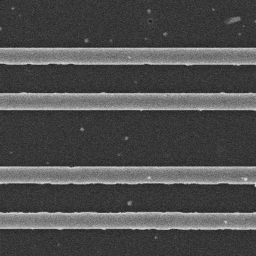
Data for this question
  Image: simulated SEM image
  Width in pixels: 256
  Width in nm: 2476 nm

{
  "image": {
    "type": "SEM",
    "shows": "lines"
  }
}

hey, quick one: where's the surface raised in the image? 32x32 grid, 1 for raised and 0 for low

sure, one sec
00000000000000000000000000000000
00000000000000000000000000000000
00000000000000000000000000000000
00000000000000000000000000000000
00000000000000000000000000000000
00000000000000000000000000000000
11111111111111111111111111111111
11111111111111111111111111111111
00000000000000000000000000000000
00000000000000000000000000000000
00000000000000000000000000000000
00000000000000000000000000000000
11111111111111111111111111111111
11111111111111111111111111111111
00000000000000000000000000000000
00000000000000000000000000000000
00000000000000000000000000000000
00000000000000000000000000000000
00000000000000000000000000000000
00000000000000000000000000000000
00000000000000000000000000000000
11111111111111111111111111111111
11111111111111111111111111111111
00000000000000000000000000000000
00000000000000000000000000000000
00000000000000000000000000000000
00000000000000000000000000000000
11111111111111111111111111111111
11111111111111111111111111111111
00000000000000000000000000000000
00000000000000000000000000000000
00000000000000000000000000000000